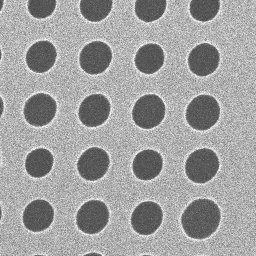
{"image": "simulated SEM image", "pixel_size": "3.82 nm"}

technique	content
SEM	a regular array of holes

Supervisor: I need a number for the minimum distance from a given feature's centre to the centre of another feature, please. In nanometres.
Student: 202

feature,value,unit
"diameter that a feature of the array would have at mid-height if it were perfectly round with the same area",123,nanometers